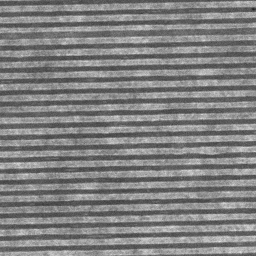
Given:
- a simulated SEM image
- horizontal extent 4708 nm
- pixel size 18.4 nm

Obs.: parallel lines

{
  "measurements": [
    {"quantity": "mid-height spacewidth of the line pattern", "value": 108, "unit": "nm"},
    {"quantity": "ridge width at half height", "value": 0.108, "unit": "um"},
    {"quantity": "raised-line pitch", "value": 206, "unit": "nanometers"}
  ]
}